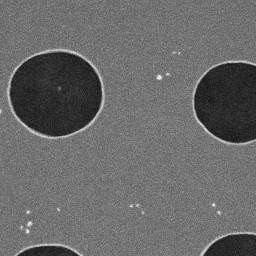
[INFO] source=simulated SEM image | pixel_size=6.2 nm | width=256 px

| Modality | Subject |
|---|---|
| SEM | holes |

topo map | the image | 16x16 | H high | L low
HHHHHHHHHHHHHHHH
HHHHHHHHHHHHHHHH
HHHHHHHHHHHHHHHH
HHLLLHHHHHHHHHHH
HLLLLLHHHHHHHLLL
HLLLLLHHHHHHLLLL
HLLLLLHHHHHHLLLL
HLLLLLHHHHHHLLLL
HHHLHHHHHHHHHLLL
HHHHHHHHHHHHHHHH
HHHHHHHHHHHHHHHH
HHHHHHHHHHHHHHHH
HHHHHHHHHHHHHHHH
HHHHHHHHHHHHHHHH
HHHHHHHHHHHHHHHH
HHLLHHHHHHHHHLLL